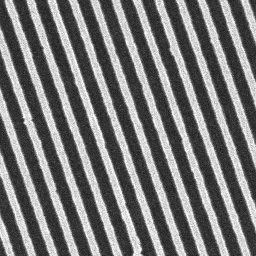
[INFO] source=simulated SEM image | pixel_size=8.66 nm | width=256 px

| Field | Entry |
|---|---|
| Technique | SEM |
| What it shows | parallel lines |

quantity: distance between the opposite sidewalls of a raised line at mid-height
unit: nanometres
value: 85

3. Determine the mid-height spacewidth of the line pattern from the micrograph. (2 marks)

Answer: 92.1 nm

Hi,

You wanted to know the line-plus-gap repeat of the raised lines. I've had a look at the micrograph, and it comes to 20.3 pixels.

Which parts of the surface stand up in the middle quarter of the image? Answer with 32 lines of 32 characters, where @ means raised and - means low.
-@@@---@@---@@@--@@@---@@---@@@-
--@@---@@@--@@@---@@---@@@---@@-
--@@---@@@---@@---@@@--@@@---@@-
--@@@---@@---@@@--@@@---@@---@@@
---@@---@@@--@@@---@@---@@@---@@
---@@---@@@---@@---@@@--@@@---@@
@--@@@---@@---@@@--@@@---@@---@@
@---@@---@@@--@@@---@@---@@@--@@
@---@@@--@@@---@@---@@@---@@---@
@---@@@---@@---@@@--@@@---@@---@
@@---@@---@@@--@@@---@@---@@@--@
@@---@@@---@@---@@---@@----@@---
@@----@@---@@---@@@--@@@---@@---
@@@---@@---@@@--@@@---@@---@@@--
-@@---@@@---@@---@@---@@@--@@@--
-@@@--@@@---@@---@@@--@@@---@@--
-@@@---@@---@@@--@@@---@@---@@@-
--@@---@@@--@@@---@@---@@@---@@-
--@@@---@@---@@---@@@---@@---@@-
---@@---@@---@@@---@@---@@---@@@
---@@---@@----@@---@@---@@@---@@
---@@@---@@---@@---@@@---@@---@@
@---@@---@@---@@@--@@@---@@@--@@
@---@@---@@@---@@---@@---@@@---@
@---@@@---@@---@@---@@@---@@---@
@@---@@---@@---@@@---@@---@@@--@
@@---@@@--@@@---@@---@@@--@@@---
@@---@@@---@@---@@---@@@---@@---
@@@--@@@---@@---@@@---@@---@@@--
@@@---@@@--@@@---@@---@@@--@@@--
-@@---@@@---@@---@@---@@@---@@--
-@@@---@@---@@@--@@@---@@---@@@-